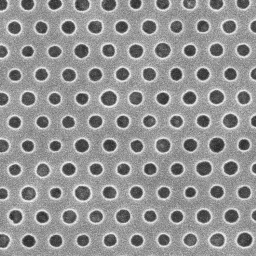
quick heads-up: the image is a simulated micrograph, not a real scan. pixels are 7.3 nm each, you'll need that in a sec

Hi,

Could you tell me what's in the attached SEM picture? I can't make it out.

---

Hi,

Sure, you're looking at a regular array of holes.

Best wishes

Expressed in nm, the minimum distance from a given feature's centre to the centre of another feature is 194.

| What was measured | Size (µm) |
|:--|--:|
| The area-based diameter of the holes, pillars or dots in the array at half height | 0.0995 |